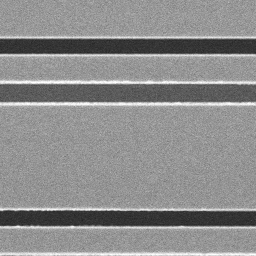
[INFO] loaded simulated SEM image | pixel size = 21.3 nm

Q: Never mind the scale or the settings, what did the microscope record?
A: lines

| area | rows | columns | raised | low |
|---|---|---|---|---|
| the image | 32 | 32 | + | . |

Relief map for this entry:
++++++++++++++++++++++++++++++++
++++++++++++++++++++++++++++++++
++++++++++++++++++++++++++++++++
++++++++++++++++++++++++++++++++
++++++++++++++++++++++++++++++++
................................
................................
++++++++++++++++++++++++++++++++
++++++++++++++++++++++++++++++++
++++++++++++++++++++++++++++++++
................................
................................
................................
++++++++++++++++++++++++++++++++
++++++++++++++++++++++++++++++++
++++++++++++++++++++++++++++++++
++++++++++++++++++++++++++++++++
++++++++++++++++++++++++++++++++
++++++++++++++++++++++++++++++++
++++++++++++++++++++++++++++++++
++++++++++++++++++++++++++++++++
++++++++++++++++++++++++++++++++
++++++++++++++++++++++++++++++++
++++++++++++++++++++++++++++++++
++++++++++++++++++++++++++++++++
++++++++++++++++++++++++++++++++
................................
................................
++++++++++++++++++++++++++++++++
++++++++++++++++++++++++++++++++
++++++++++++++++++++++++++++++++
++++++++++++++++++++++++++++++++